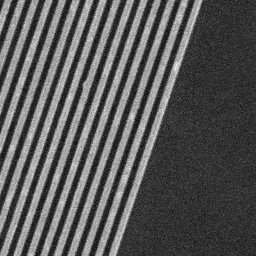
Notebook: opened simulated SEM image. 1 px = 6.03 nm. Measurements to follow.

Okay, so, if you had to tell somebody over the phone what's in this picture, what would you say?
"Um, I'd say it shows parallel lines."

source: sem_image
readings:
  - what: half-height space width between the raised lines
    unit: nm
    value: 40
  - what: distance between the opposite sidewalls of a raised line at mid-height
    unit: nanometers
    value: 34.3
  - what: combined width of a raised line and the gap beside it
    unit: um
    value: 0.0777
